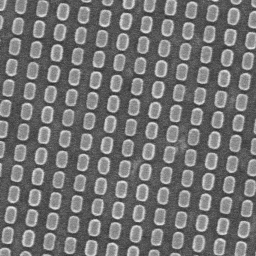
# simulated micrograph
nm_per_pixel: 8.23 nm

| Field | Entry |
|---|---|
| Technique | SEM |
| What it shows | a regular array of raised bodies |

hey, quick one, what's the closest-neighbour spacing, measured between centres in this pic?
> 171 nm